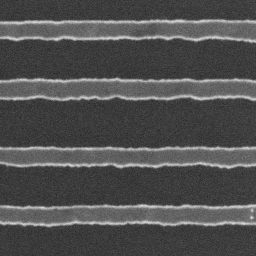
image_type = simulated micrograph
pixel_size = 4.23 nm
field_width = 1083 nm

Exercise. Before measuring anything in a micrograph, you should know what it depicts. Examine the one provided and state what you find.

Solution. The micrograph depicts lines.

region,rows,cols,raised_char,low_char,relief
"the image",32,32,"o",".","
................................
................................
................................
oooooooooooooooooooooooooooooooo
oooooooooooooooooooooooooooooooo
................................
................................
................................
................................
................................
oooooooooooooooooooooooooooooooo
oooooooooooooooooooooooooooooooo
................................
................................
................................
................................
................................
................................
oo.oooo......o......oooooo.o..oo
oooooooooooooooooooooooooooooooo
oooooooooooooooooooooooooooooooo
................................
................................
................................
................................
................................
oooooooooooooooooooooooooooooooo
oooooooooooooooooooooooooooooooo
................................
................................
................................
................................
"